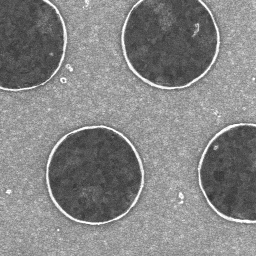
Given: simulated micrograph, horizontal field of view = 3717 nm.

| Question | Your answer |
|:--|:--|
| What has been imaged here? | raised bodies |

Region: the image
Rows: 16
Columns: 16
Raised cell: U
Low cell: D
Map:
UUUDDDDDUUUUUDDD
UUUUDDDDUUUUUDDD
UUUUDDDDUUUUUUDD
UUUUDDDDUUUUUDDD
UUUDDDDDUUUUUDDD
UUDDDDDDDDUDDDDD
DDDDDDDDDDDDDDDD
DDDDDDDDDDDDDDDD
DDDDUUUUDDDDDDUU
DDDUUUUUDDDDDUUU
DDDUUUUUUDDDUUUU
DDDUUUUUUDDDDUUU
DDDUUUUUDDDDDUUU
DDDDUUUUDDDDDDUU
DDDDDDDDDDDDDDDD
DDDDDDDDDDDDDDDD